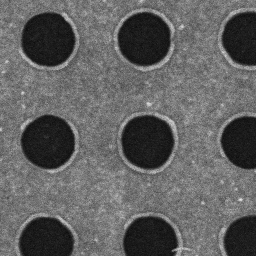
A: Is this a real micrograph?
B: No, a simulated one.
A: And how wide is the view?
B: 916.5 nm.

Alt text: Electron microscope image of holes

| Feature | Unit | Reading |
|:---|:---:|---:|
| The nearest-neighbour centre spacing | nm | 350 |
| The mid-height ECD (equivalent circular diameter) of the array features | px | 53.4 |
